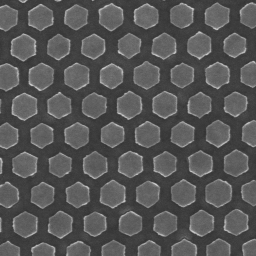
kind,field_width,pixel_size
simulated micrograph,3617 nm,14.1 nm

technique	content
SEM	a regular array of raised bodies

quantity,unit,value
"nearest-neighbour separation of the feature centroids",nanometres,482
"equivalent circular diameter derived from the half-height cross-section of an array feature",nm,352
